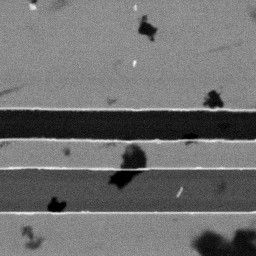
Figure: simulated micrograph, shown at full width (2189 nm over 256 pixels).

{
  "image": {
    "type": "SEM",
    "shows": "lines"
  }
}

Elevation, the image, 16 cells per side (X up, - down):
XXXXXXXXXXXXXXXX
XXXXXXXXXXXXXXXX
XXXXXXXXXXXXXXXX
XXXXXXXXXXXXXXXX
XXXXXXXXXXXXXXXX
XXXXXXXXXXXXXXXX
XXXXXXXXXXXXXXXX
----------------
----------------
XXXXXXXXXXXXXXXX
X-XXXXXXXXXXXXXX
----------------
----------------
XXXXXXXXXXXXXXXX
XXXXXXXXXXXXXXXX
XXXXXXXXXXXXXXXX